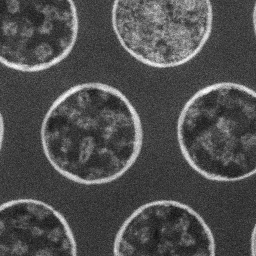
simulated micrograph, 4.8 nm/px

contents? raised bodies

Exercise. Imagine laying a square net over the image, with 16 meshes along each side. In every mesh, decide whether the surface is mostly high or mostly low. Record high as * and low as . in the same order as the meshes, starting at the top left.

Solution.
*****..******...
*****..******...
*****...*****...
****.....***....
................
.....**......**.
...*****....****
...******..*****
...******..*****
...******...****
....****....****
................
................
****....****....
****....*****...
*****..******...